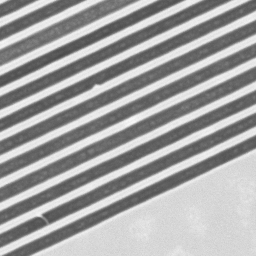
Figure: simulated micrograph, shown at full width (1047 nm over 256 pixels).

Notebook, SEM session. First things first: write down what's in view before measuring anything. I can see parallel lines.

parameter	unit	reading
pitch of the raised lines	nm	84.8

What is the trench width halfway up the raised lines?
48.1 nanometres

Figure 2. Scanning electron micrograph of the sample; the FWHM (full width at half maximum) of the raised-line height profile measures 36.1 nm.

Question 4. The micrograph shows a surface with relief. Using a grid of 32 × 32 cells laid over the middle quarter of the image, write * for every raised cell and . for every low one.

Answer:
.......*****.......*****.......*
.....*****.......*****.......***
...*****......******.......*****
.****........****........****...
***.......*****........****.....
*.......*****........****.......
......*****........****........*
....*****.......*****........***
..*****........****........****.
*****.......*****.......*****...
***.......*****.......*****.....
*.......*****.......*****.......
......****........*****........*
....****........*****........***
..****........*****.......*****.
****........*****.......*****...
**........*****.......*****.....
........****........*****.......
.....*****........*****.......**
...*****........*****.......****
.*****........*****.......*****.
****........*****.......*****...
**........****........****......
.......*****.......*****.......*
.....*****.......*****.......***
...*****.......*****.......*****
.*****.......****........*****..
****.......****........****.....
**.......****........*****......
.......****........*****......**
.....****........*****.......***
...****........****.......******